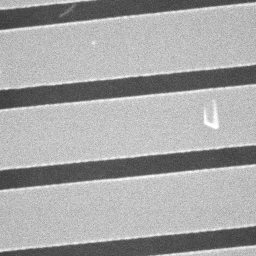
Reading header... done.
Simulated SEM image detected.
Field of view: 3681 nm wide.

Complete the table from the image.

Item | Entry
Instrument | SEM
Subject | lines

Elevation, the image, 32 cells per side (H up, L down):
HHHHHHLLLLLLLLLLLLLLLLLLLLLLLLHH
LLLLLLLLLLLLLLLLLLLLLHHHHHHHHHHH
LLLLLLLLLLLLHHHHHHHHHHHHHHHHHHHH
LLHHHHHHHHHHHHHHHHHHHHHHHHHHHHHH
HHHHHHHHHHHHHHHHHHHHHHHHHHHHHHHH
HHHHHHHHHHHHHHHHHHHHHHHHHHHHHHHH
HHHHHHHHHHHHHHHHHHHHHHHHHHHHHHHH
HHHHHHHHHHHHHHHHHHHHHHHHHHHHHHHH
HHHHHHHHHHHHHHHHHHHHHHHHHHHHLLLL
HHHHHHHHHHHHHHHHHHLLLLLLLLLLLLLL
HHHHHHHLLLLLLLLLLLLLLLLLLLLLLLLL
LLLLLLLLLLLLLLLLLLLLLLLHHHHHHHHH
LLLLLLLLLLLLLHHHHHHHHHHHHHHHHHHH
LLHHHHHHHHHHHHHHHHHHHHHHHHHHHHHH
HHHHHHHHHHHHHHHHHHHHHHHHHHHHHHHH
HHHHHHHHHHHHHHHHHHHHHHHHHHHHHHHH
HHHHHHHHHHHHHHHHHHHHHHHHHHHHHHHH
HHHHHHHHHHHHHHHHHHHHHHHHHHHHHHHH
HHHHHHHHHHHHHHHHHHHHHHHHHHHHLLLL
HHHHHHHHHHHHHHHHHHLLLLLLLLLLLLLL
HHHHHHHLLLLLLLLLLLLLLLLLLLLLLLLL
LLLLLLLLLLLLLLLLLLLLLLLHHHHHHHHH
LLLLLLLLLLLLLHHHHHHHHHHHHHHHHHHH
LLLHHHHHHHHHHHHHHHHHHHHHHHHHHHHH
HHHHHHHHHHHHHHHHHHHHHHHHHHHHHHHH
HHHHHHHHHHHHHHHHHHHHHHHHHHHHHHHH
HHHHHHHHHHHHHHHHHHHHHHHHHHHHHHHH
HHHHHHHHHHHHHHHHHHHHHHHHHHHHHHHH
HHHHHHHHHHHHHHHHHHHHHHHHHHHHHLLL
HHHHHHHHHHHHHHHHHHHHLLLLLLLLLLLL
HHHHHHHHHLLLLLLLLLLLLLLLLLLLLLLL
LLLLLLLLLLLLLLLLLLLLLLLLHHHHHHHH